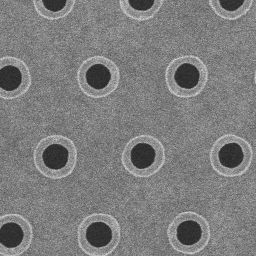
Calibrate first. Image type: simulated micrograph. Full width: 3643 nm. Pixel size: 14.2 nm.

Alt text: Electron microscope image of ring-shaped raised bodies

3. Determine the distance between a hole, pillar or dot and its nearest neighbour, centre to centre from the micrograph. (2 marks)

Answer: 1250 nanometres